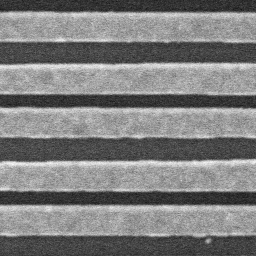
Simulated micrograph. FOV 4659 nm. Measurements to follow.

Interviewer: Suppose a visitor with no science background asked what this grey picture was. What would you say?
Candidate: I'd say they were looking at lines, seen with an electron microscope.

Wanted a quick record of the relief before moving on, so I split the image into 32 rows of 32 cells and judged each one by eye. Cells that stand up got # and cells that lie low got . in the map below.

................................
................................
################################
################################
################################
................................
................................
................................
################################
################################
################################
################################
................................
................................
################################
################################
################################
................................
................................
................................
################################
################################
################################
################################
................................
................................
################################
################################
################################
................................
................................
................................